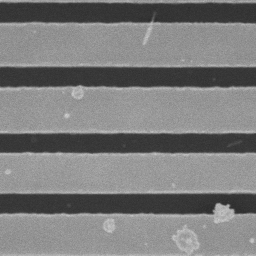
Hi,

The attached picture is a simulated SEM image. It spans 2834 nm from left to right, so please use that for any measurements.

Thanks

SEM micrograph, lines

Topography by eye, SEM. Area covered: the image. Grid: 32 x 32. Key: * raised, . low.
................................
................................
................................
********************************
********************************
********************************
********************************
********************************
................................
................................
................................
********************************
********************************
********************************
********************************
********************************
********************************
................................
................................
********************************
********************************
********************************
********************************
********************************
................................
................................
...........................**...
********************************
********************************
********************************
********************************
********************************